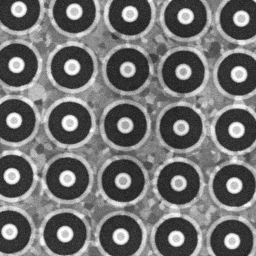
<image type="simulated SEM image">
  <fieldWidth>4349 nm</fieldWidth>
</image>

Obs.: an array of small figures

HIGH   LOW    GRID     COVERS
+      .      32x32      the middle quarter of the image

++++....++....+++.....++.....++.
++++....++....++++....++....+++.
........++.....++.....++....+++.
.......+++...........+++.....+..
.......++++..........+++........
.....+++++++........+++++.......
....+++++++++......+++++++......
++++++++++++++++++++++++++++....
++++++++++++++++++++++++++++++++
....++++++++++...+++++++++++++++
.....+++++++.......++++++++....+
......+++++.........+++++.......
.......+++...........++++.......
++.....+++...........+++........
+++....++.....+++....+++....++..
+++....++.....+++....++.....+++.
.......+++....++.....++.....+++.
.......+++...........+++.....+..
......++++..........++++........
.....++++++........++++++.......
...+++++++++......++++++++......
+++++++++++++++++++++++++++....+
++++++++++++++++++++++++++++++++
....+++++++++...++++++++++++++++
.....++++++.......++++++++.....+
......++++.........++++++.......
......+++...........++++........
++.....++...........+++.........
++.....++....+++.....++.....++..
++.....++....+++.....++....+++..
......+++....+++.....++....+++..
......+++...........+++.........